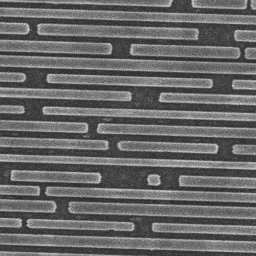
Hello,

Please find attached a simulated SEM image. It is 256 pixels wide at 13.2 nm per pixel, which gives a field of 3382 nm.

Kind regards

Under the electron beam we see parallel lines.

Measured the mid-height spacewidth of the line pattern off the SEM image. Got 87.4 nm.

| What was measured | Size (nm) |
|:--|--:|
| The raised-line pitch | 214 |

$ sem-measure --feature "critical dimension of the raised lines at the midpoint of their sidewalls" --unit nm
124